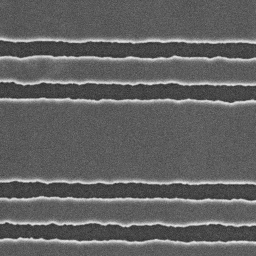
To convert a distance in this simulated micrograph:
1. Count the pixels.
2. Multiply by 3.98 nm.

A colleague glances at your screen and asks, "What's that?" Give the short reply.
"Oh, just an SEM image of lines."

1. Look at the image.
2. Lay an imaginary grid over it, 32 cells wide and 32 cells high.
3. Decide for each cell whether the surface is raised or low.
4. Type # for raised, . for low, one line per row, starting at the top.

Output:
################################
################################
################################
################################
################################
................................
................................
################################
################################
################################
..##...........##.#...##########
................................
#########...........##.#........
################################
################################
################################
################################
################################
################################
################################
################################
################################
################################
................................
................................
################################
################################
################################
................................
................................
################################
################################